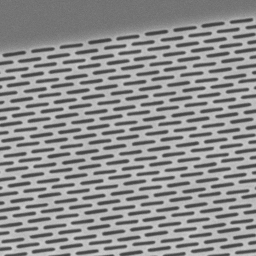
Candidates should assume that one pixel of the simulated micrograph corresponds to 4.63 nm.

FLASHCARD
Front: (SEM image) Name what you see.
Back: a regular array of holes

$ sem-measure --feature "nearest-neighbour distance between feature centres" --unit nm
69